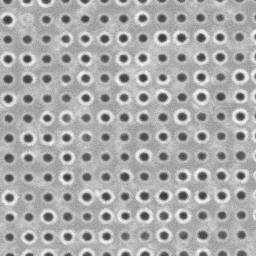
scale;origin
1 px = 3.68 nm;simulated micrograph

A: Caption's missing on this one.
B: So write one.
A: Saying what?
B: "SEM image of a regular array of holes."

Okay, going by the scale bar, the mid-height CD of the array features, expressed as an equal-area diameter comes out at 36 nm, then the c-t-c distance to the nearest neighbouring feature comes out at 70.6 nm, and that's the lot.